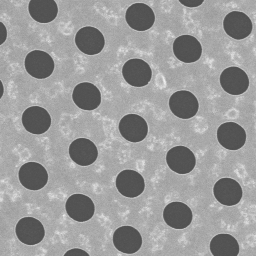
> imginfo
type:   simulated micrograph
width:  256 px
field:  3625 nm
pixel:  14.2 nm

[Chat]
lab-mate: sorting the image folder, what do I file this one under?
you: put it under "a regular array of holes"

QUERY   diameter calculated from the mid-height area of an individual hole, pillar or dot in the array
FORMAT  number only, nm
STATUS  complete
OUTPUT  410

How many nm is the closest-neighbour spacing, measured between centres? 786